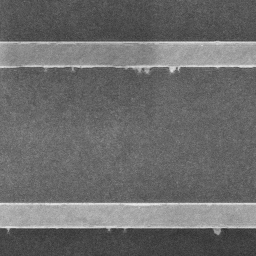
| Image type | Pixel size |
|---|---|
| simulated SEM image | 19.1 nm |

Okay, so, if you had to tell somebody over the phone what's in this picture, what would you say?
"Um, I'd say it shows lines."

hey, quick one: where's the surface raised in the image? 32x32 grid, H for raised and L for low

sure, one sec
LLLLLLLLLLLLLLLLLLLLLLLLLLLLLLLL
LLLLLLLLLLLLLLLLLLLLLLLLLLLLLLLL
LLLLLLLLLLLLLLLLLLLLLLLLLLLLLLLL
LLLLLLLLLLLLLLLLLLLLLLLLLLLLLLLL
LLLLLLLLLLLLLLLLLLLLLLLLLLLLLLLL
HHHHHHHHHHHHHHHHHHHHHHHHHHHHHHHH
HHHHHHHHHHHHHHHHHHHHHHHHHHHHHHHH
HHHHHHHHHHHHHHHHHHHHHHHHHHHHHHHH
LLLLLLLLLLLLLLLLLLLLLLLLLLLLLLLL
LLLLLLLLLLLLLLLLLLLLLLLLLLLLLLLL
LLLLLLLLLLLLLLLLLLLLLLLLLLLLLLLL
LLLLLLLLLLLLLLLLLLLLLLLLLLLLLLLL
LLLLLLLLLLLLLLLLLLLLLLLLLLLLLLLL
LLLLLLLLLLLLLLLLLLLLLLLLLLLLLLLL
LLLLLLLLLLLLLLLLLLLLLLLLLLLLLLLL
LLLLLLLLLLLLLLLLLLLLLLLLLLLLLLLL
LLLLLLLLLLLLLLLLLLLLLLLLLLLLLLLL
LLLLLLLLLLLLLLLLLLLLLLLLLLLLLLLL
LLLLLLLLLLLLLLLLLLLLLLLLLLLLLLLL
LLLLLLLLLLLLLLLLLLLLLLLLLLLLLLLL
LLLLLLLLLLLLLLLLLLLLLLLLLLLLLLLL
LLLLLLLLLLLLLLLLLLLLLLLLLLLLLLLL
LLLLLLLLLLLLLLLLLLLLLLLLLLLLLLLL
LLLLLLLLLLLLLLLLLLLLLLLLLLLLLLLL
LLLLLLLLLLLLLLLLLLLLLLLLLLLLLLLL
HHHLLLLHHHHHHHHHHHHHHHHHHHHHHHHH
HHHHHHHHHHHHHHHHHHHHHHHHHHHHHHHH
HHHHHHHHHHHHHHHHHHHHHHHHHHHHHHHH
LLLLLLLLLLLLLLLLLLLLLLLLLLLLLLLL
LLLLLLLLLLLLLLLLLLLLLLLLLLLLLLLL
LLLLLLLLLLLLLLLLLLLLLLLLLLLLLLLL
LLLLLLLLLLLLLLLLLLLLLLLLLLLLLLLL